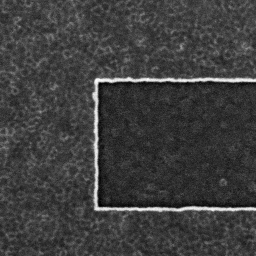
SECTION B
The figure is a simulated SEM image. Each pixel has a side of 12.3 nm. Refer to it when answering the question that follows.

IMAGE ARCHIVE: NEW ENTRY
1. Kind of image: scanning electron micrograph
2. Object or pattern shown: one or a few lines or trenches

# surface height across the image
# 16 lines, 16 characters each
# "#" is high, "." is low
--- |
################
################
################
################
################
######..........
######..........
######..........
######..........
######..........
######..........
######..........
######..........
################
################
################